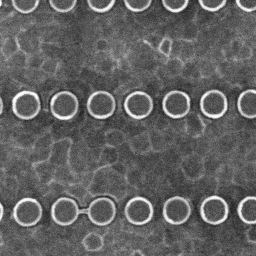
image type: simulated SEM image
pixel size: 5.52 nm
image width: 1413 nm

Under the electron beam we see a regular array of raised bodies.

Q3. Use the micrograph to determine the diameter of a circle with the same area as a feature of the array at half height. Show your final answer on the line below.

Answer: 151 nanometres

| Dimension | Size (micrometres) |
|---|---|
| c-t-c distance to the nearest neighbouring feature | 0.206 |